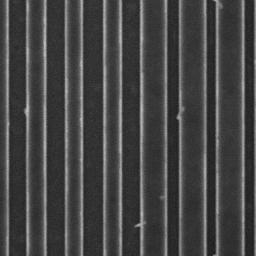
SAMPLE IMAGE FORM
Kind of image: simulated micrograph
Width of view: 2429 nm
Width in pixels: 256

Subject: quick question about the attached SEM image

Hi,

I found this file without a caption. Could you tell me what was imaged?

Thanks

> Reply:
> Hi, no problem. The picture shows parallel lines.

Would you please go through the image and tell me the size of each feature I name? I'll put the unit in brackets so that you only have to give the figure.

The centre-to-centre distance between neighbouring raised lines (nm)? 368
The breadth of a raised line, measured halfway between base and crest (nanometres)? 214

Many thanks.